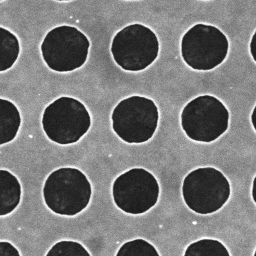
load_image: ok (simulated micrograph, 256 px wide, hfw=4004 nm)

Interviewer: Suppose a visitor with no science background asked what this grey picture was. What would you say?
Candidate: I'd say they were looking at a regular array of holes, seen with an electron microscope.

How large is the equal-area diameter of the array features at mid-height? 736 nm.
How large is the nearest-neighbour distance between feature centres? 1.08 µm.